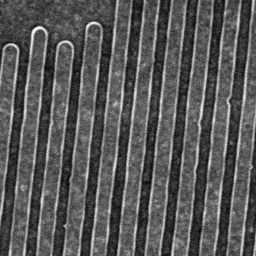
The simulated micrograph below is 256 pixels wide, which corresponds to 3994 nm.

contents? parallel lines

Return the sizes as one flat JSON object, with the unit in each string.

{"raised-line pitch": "422 nm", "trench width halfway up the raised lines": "180 nanometers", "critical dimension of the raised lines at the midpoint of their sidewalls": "240 nm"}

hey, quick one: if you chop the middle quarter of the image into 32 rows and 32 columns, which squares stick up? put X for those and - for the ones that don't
XX---XXXX---XXX---XXXX---XXXX---
XX---XXX----XXX---XXXX---XXXX---
XX--XXXX---XXXX---XXXX---XXXX---
X---XXXX---XXXX---XXXX---XXXX---
X---XXXX---XXXX---XXXX---XXX----
X---XXXX---XXXX---XXXX---XXX---X
X---XXXX---XXXX---XXXX---XXX---X
X---XXXX---XXXX---XXX---XXXX---X
X---XXXX---XXXX---XXX---XXXX---X
X---XXXX---XXX---XXXX---XXXX---X
X---XXXX---XXX---XXXX---XXXX---X
X---XXX----XXX---XXXX---XXXX---X
X---XXX---XXXX---XXXX---XXXX---X
----XXX---XXXX---XXXX---XXXX---X
---XXXX---XXXX---XXXX---XXX----X
---XXXX---XXXX---XXXX---XXXX---X
---XXXX---XXXX---XXX----XXX---XX
---XXXX---XXXX---XXXX--XXXX---XX
---XXXX---XXX----XXX---XXXX---XX
---XXXX---XXX---XXXX---XXXX---XX
---XXX----XXX---XXXX---XXXX---XX
---XXX---XXXX---XXXX---XXXX---XX
--XXXX---XXXX---XXXX---XXXX---XX
--XXXX---XXXX---XXXX---XXXX---XX
--XXXX---XXXX---XXXX---XXXX--XXX
--XXXX---XXXX---XXXX---XXX---XXX
--XXXX---XXXX---XXX----XXX---XXX
--XXXX---XXXX---XXX---XXXX---XXX
--XXXX---XXX----XXX---XXXX---XXX
--XXXX---XXX----XXX---XXXX---XXX
--XXX----XXX---XXXX---XXXX---XXX
-XXXX---XXXX---XXXX---XXXX---XXX